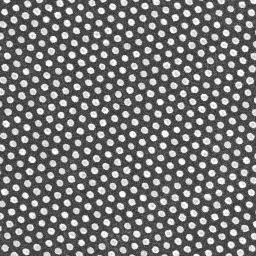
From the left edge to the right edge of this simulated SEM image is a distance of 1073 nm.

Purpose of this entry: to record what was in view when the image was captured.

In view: a regular array of raised bodies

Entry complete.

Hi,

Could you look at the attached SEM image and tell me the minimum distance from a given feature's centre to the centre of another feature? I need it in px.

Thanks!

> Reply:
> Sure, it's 12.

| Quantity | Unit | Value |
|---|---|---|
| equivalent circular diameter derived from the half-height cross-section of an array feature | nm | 27.2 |